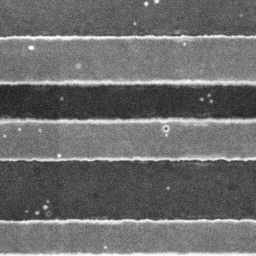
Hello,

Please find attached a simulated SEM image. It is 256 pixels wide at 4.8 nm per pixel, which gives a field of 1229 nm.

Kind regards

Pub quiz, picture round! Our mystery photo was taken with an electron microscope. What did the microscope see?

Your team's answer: lines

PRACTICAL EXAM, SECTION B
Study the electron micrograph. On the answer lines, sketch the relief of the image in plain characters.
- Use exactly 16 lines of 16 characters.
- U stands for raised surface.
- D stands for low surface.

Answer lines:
DDDDDDDDDDDDDDDD
DDDDDDDDDDDDDDDD
UUUUUUUUUUUUUUUU
UUUUUUUUUUUUUUUU
UUUUUUUUUUUUUUUU
DDDDDDDDDDDDDDDD
DDDDDDDDDDDDDDDD
DDDDDDDDDDUDDDDD
UUUUUUUUUUUUUUUU
UUUUUUUUUUUUUUUU
DDDDDDDDDDDDDDDD
DDDDDDDDDDDDDDDD
DDDDDDDDDDDDDDDD
DDDDDDDDDDDDDDDD
UUUUUUUUUUUUUUUU
UUUUUUUUUUUUUUUU